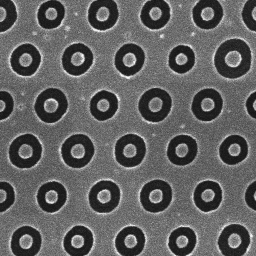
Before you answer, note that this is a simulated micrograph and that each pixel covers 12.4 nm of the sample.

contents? a regular array of ring-shaped grooves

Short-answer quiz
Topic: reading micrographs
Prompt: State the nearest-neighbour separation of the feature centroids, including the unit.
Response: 638 nm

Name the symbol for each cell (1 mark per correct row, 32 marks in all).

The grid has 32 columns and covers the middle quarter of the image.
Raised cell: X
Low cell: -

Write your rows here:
-------XXXXXX---X---XXXXXX------
------XXXXXXX------XXXXXXXX-----
X----XXXXXXXXX----XXXXXXXXXXX-XX
XXXXXXXXXXXXXXXXXXXXXXXXXXXXXXXX
XXXXXXXXXXXXXXXXXXXXXXXXXXXXXXXX
XXXXXXXXXXXXXXXXXXXXXXXXXXXXXXXX
XXXXXXXXXXXXXXXXXXXXX----XXXXXXX
XXXXXXXX----XXXXXXXX------XXXXXX
-XXXXXX------XXXXXX--------XXXXX
-XXXXX---XX---XXXXX--XXX---XXXXX
-XXXXX--XXX---XXXX---XXX---XXXXX
-XXXXX---XX--XXXXXX---XX---XXXXX
XXXXXXX------XXXXXX-------XXXXXX
XXXXXXXX----XXXXXXXX-----XXXXXXX
XXXXXXXXXXXXXXXXXXXXX---XXXXXXXX
XXXXXXXXXXXXXXXXXXXXXXXXXXXXXXXX
XXXXXXXXXXXXXXXXXXXXXXXXXXXXXXXX
XXX--XXXXXXXXXXX--XXXXXXXXXXXXXX
X-----XXXXXXXX-----XXXXXXXX-----
-------XXXXXX-------XXXXXX------
--XXX--XXXXXX--XXX--XXXXXX--XXX-
--XXX---XXXXX--XXX---XXXXX--XXX-
--XXX--XXXXXX--XXX--XXXXXX--XX--
-------XXXXXX-------XXXXXX------
------XXXXXXX------XXXXXXXX-----
X----XXXXXXXXXX---XXXXXXXXXXX-XX
XXXXXXXXXXXXXXXXXXXXXXXXXXXXXXXX
XXXXXXXXXXXXXXXXXXXXXXXXXXXXXXXX
XXXXXXXXXXXXXXXXXXXXXXXXXXXXXXXX
XXXXXXXX-----XXXXXXXX-----XXXXXX
XXXXXXX-------XXXXXX-------XXXXX
-XXXXXX---X---XXXXX--------XXXXX